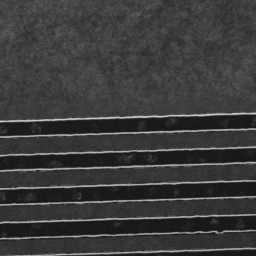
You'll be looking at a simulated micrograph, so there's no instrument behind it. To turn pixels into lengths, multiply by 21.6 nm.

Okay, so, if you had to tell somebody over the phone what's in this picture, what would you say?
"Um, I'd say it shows parallel lines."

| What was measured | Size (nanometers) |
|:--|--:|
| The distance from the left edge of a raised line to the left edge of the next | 731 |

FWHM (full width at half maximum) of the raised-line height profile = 346 nanometers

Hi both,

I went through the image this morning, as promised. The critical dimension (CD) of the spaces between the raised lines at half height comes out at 0.389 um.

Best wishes